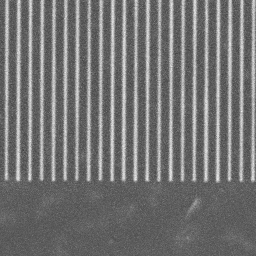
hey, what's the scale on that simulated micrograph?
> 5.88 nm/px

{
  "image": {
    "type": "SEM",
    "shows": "parallel lines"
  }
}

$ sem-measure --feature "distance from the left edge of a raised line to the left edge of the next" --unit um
0.0691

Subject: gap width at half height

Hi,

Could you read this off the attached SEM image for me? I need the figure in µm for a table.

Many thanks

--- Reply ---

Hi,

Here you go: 0.0566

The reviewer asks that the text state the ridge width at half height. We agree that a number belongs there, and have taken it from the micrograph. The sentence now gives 0.0103 microns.